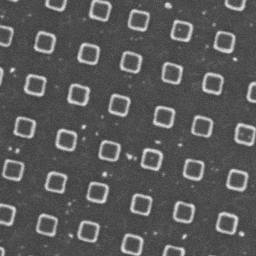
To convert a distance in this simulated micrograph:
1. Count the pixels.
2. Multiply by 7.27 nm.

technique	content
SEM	a regular array of raised bodies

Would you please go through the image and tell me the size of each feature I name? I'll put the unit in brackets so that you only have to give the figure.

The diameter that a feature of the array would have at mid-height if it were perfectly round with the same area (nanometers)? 147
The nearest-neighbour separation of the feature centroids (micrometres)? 0.309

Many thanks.